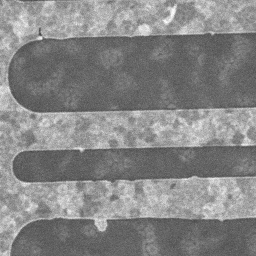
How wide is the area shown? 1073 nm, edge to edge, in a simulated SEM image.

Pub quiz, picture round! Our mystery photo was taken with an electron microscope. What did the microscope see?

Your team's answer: one or a few lines or trenches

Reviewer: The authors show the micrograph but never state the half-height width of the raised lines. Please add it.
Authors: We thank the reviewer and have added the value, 156 nanometres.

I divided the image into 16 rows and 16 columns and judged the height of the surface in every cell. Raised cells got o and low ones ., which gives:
oooooooooooooooo
oooooooooooooooo
oo..............
o...............
................
o...............
o...............
oooooooooooooooo
oooooooooooooooo
o...............
o...............
oooooooooooooooo
oooooooooooooooo
oooooooooooooooo
o...............
o...............